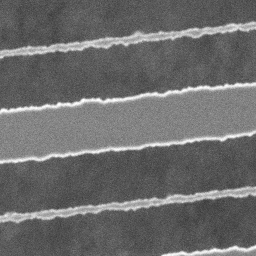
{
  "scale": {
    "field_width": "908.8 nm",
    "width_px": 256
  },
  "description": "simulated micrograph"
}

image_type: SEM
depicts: lines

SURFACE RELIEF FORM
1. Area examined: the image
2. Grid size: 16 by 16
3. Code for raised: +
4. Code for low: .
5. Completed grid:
................
................
................
................
................
............++++
....++++++++++++
++++++++++++++++
+++++++++++++++.
++++++..........
................
................
................
................
................
..............++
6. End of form